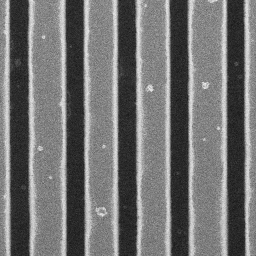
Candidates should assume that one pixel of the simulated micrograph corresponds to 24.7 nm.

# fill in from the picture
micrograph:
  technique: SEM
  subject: lines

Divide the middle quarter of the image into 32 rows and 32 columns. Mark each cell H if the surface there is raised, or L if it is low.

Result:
LLLLLHHHHHHHHLLLLLHHHHHHHHLLLLLH
LLLLLHHHHHHHHLLLLLHHHHHHHHLLLLLH
LLLLLHHHHHHHHLLLLLHHHHHHHHLLLLLH
LLLLLHHHHHHHHLLLLLHHHHHHHHLLLLLH
LLLLLHHHHHHHHLLLLLHHHHHHHHLLLLLH
LLLLLHHHHHHHHLLLLLHHHHHHHHLLLLLH
LLLLLHHHHHHHHLLLLLHHHHHHHHLLLLLH
LLLLLHHHHHHHHLLLLLHHHHHHHHLLLLLH
LLLLLHHHHHHHHLLLLLHHHHHHHHLLLLLH
LLLLLHHHHHHHHLLLLLHHHHHHHHLLLLLH
LLLLLHHHHHHHHLLLLLHHHHHHHHLLLLLH
LLLLLHHHHHHHHLLLLLHHHHHHHHLLLLLH
LLLLLHHHHHHHHLLLLLHHHHHHHHLLLLLH
LLLLLHHHHHHHHLLLLLHHHHHHHHLLLLLH
LLLLLHHHHHHHHLLLLLHHHHHHHHLLLLLH
LLLLLHHHHHHHHLLLLLHHHHHHHHLLLLLH
LLLLLHHHHHHHHLLLLLHHHHHHHHLLLLLH
LLLLLHHHHHHHHLLLLLHHHHHHHHLLLLLH
LLLLLHHHHHHHHLLLLLHHHHHHHHLLLLLH
HLLLLHHHHHHHHLLLLLHHHHHHHHLLLLLH
HLLLLHHHHHHHHLLLLLHHHHHHHHLLLLLH
HLLLLHHHHHHHHLLLLLHHHHHHHHLLLLLH
HLLLLHHHHHHHHLLLLLHHHHHHHHLLLLLH
HLLLLHHHHHHHHLLLLLHHHHHHHHLLLLLH
HLLLLHHHHHHHHLLLLLHHHHHHHHLLLLLH
LLLLLHHHHHHHHLLLLLHHHHHHHHLLLLLH
LLLLLHHHHHHHHLLLLLHHHHHHHHLLLLLH
HLLLLHHHHHHHHLLLLLHHHHHHHHLLLLLH
HLLLLHHHHHHHHLLLLLHHHHHHHHLLLLLH
HLLLLHHHHHHHHLLLLLHHHHHHHHLLLLLH
HLLLLHHHHHHHHLLLLLHHHHHHHHLLLLLH
HLLLLHHHHHHHHLLLLLHHHHHHHHLLLLLH